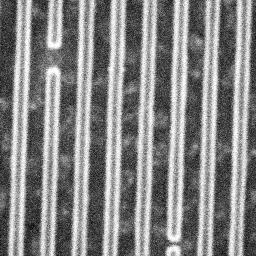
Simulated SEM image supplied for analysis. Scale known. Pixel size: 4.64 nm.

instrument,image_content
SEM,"parallel lines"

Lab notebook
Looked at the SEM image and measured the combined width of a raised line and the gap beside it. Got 31.5 px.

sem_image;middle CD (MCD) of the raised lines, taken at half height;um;0.0481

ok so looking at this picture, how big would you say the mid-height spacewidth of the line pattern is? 20.6 pixels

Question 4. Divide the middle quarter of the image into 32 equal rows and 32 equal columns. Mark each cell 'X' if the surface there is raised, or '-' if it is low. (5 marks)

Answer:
----XXX-----XX------XX------XX--
----XX------XXX-----XX------XX--
----XX------XX------XX------XX--
----XX------XX------XX------XX--
----XX------XX------XX-----XXX--
----XX------XX------XX-----XXX--
----XX------XX------XX-----XXX--
----XX------XX------XX-----XXX--
----XX------XX------XX-----XXX--
----XX-----XXX------XX-----XXX--
----XX-----XXX------XX------XX--
----XX-----XXX------XX-----XXX--
----XX-----XXX-----XXX-----XXX--
---XXX-----XXX-----XXX-----XXX--
---XXX-----XXX-----XXX-----XX---
----XX-----XXX-----XXX-----XX---
---XXX-----XXX-----XXX-----XX---
---XXX-----XXX-----XXX-----XX---
---XXX-----XXX-----XXX-----XX---
---XXX-----XXX-----XXX-----XX---
---XXX-----XXX-----XXX-----XX---
---XXX-----XXX-----XXX-----XX---
---XXX-----XXX-----XX------XX---
---XXX-----XXX-----XX------XX---
---XXX-----XXX-----XX------XX---
---XXX-----XXX-----XX------XX---
---XXX-----XXX-----XX------XX---
---XXX-----XXX-----XX------XX---
---XXX-----XXX-----XX------XX---
---XXX-----XXX-----XX------XX---
---XXX-----XX------XX------XX---
---XX------XX------XX------XX---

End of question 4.